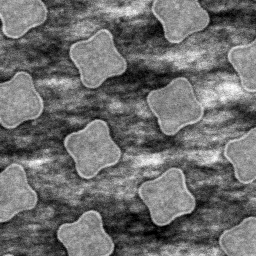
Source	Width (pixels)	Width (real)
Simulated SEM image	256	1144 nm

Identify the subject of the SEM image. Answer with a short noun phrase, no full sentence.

raised bodies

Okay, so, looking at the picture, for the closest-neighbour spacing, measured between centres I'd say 0.4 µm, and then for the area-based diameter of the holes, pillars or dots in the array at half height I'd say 0.226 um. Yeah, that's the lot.